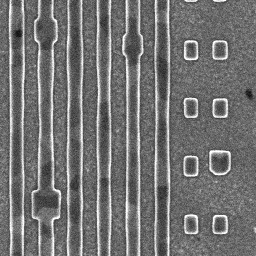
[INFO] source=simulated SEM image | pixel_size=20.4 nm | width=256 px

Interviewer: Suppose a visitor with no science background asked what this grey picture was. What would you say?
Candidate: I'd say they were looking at wiring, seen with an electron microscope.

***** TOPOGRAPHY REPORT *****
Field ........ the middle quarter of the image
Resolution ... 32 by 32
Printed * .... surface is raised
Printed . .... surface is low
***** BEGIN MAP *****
.****...****....***....***......
.****...****....***....***......
.****....**.....***....***......
.****....**.....***....***......
.***.....**.....***....***......
.***.....**.....***....***......
.***.....**.....***....***......
.***.....**.....***....***......
.***.....**.....***....***......
.***.....**.....***....***....**
.***.....**.....***....***....**
.***.....**.....***....***....**
.***....****....***....***....**
.***....****....***....***......
.***....****....***....***......
.***....****....***....***......
.***....****....***....***......
.***....****....***....***......
.***....****....***....***......
.****...****....***....***......
.****...****....***....***......
.****...****....***....***......
.****...****....***....***......
.***....****....***....***....**
.***.....***....***....***....**
.***.....***....***....***....**
.***.....**.....***....***....**
.***.....**.....***....***....**
.***.....**.....***....***......
.***.....**.....***....***......
.***.....**.....***....***......
.***.....**.....***....***......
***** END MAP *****